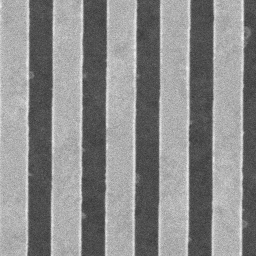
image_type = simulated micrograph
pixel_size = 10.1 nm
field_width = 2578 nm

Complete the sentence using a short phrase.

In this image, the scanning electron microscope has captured lines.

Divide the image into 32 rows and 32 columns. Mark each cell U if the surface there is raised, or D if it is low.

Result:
UUUUDDDUUUDDDUUUUDDDUUUUDDDUUUDD
UUUUDDDUUUDDDUUUUDDDUUUUDDDUUUDD
UUUUDDDUUUDDDUUUUDDDUUUUDDDUUUDD
UUUUDDDUUUDDDUUUUDDDUUUUDDDUUUDD
UUUUDDDUUUDDDUUUUDDDUUUUDDDUUUDD
UUUUDDDUUUDDDUUUUDDDUUUUDDDUUUDD
UUUUDDDUUUDDDUUUUDDDUUUUDDDUUUDD
UUUUDDDUUUDDDUUUUDDDUUUUDDDUUUDD
UUUUDDDUUUDDDUUUUDDDUUUUDDDUUUDD
UUUUDDDUUUDDDUUUUDDDUUUUDDDUUUDD
UUUUDDDUUUDDDUUUUDDDUUUUDDDUUUDD
UUUUDDDUUUDDDUUUUDDDUUUUDDDUUUDD
UUUUDDDUUUDDDUUUUDDDUUUUDDDUUUDD
UUUUDDDUUUDDDUUUUDDDUUUUDDDUUUDD
UUUDDDDUUUDDDUUUUDDDUUUUDDDUUUDD
UUUUDDDUUUDDDUUUUDDDUUUUDDDUUUDD
UUUUDDDUUUDDDUUUUDDDUUUUDDDUUUDD
UUUUDDDUUUDDDUUUUDDDUUUUDDDUUUDD
UUUUDDDUUUDDDUUUUDDDUUUUDDDUUUDD
UUUUDDDUUUDDDUUUUDDDUUUUDDDUUUDD
UUUDDDDUUUDDDUUUUDDDUUUUDDDUUUDD
UUUDDDDUUUDDDUUUUDDDUUUUDDDUUUDD
UUUDDDUUUUDDDUUUUDDDUUUUDDDUUUDD
UUUDDDUUUUDDDUUUUDDDUUUUDDDUUUDD
UUUDDDUUUUDDDUUUUDDDUUUUDDDUUUDD
UUUDDDUUUUDDDUUUUDDDUUUUDDDUUUDD
UUUDDDUUUUDDDUUUUDDDUUUUDDDUUUDD
UUUDDDUUUUDDDUUUUDDDUUUUDDDUUUDD
UUUDDDUUUUDDDUUUUDDDUUUUDDDUUUDD
UUUDDDUUUUDDDUUUUDDDUUUUDDDUUUDD
UUUDDDUUUUDDDUUUUDDDUUUUDDDUUUDD
UUUDDDUUUUDDDUUUUDDDUUUDDDDUUUDD